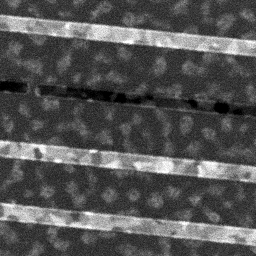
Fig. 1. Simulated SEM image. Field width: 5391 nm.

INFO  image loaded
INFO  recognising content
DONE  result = one or a few lines or trenches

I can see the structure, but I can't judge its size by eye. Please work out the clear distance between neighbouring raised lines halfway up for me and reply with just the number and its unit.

1030 nanometers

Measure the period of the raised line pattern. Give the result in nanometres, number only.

1320